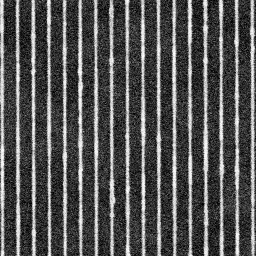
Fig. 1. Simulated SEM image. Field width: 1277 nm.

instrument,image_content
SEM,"parallel lines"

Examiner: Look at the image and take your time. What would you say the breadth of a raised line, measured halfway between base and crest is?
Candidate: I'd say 10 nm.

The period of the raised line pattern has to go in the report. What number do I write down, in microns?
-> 0.0781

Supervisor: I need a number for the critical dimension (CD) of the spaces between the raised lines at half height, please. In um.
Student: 0.0698